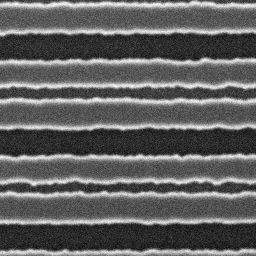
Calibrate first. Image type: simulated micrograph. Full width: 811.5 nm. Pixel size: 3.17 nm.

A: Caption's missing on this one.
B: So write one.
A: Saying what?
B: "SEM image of lines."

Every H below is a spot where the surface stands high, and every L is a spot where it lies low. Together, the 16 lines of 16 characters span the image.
HHHHHHHHHHHHHHHH
HHHHHHHHHHHHHHHH
LLLLLLLLLLLLLLLL
LLLLLLLLLLLLLLLL
HHHHHHHHHHHHHHHH
HHHHHHHHHHHHHHHH
HHHHHHHHHHHHHHHH
HHHHHHHHHHHHHHHH
LLLLLLLLLLLLLLLL
LLLLLLLLLLLLLLLL
HHHHHHHHHHHHHHHH
HHHHHHHHHHHHHHHH
HHHHHHHHHHHHHHHH
HHHHHHHHHHHHHHHH
LLLLLLLLLLLLLLLL
LLLLLLLLLLLLLLLL